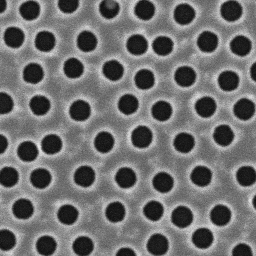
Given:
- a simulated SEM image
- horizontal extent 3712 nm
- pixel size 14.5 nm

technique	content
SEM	a regular array of holes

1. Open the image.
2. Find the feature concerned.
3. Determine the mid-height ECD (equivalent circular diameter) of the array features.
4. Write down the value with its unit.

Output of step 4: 0.324 µm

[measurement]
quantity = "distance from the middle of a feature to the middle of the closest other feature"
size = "0.473 µm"